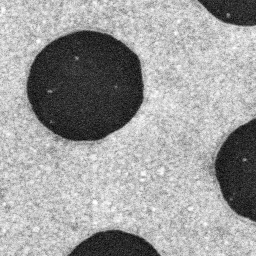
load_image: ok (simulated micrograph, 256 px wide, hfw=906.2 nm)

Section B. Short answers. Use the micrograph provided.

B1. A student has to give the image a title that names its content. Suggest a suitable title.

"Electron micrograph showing holes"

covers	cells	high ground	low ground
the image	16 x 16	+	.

+++++++++++++...
++++++++++++++..
+++....+++++++++
++.......+++++++
++.......+++++++
++.......+++++++
++.......+++++++
++......++++++++
++++...+++++++..
++++++++++++++..
+++++++++++++...
++++++++++++++..
++++++++++++++..
+++++++++++++++.
++++++..++++++++
+++++.....++++++